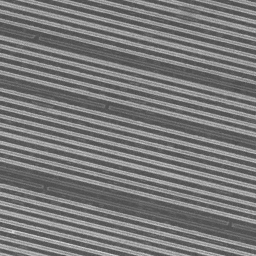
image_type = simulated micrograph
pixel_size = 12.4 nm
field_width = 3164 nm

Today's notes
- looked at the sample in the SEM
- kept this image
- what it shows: parallel lines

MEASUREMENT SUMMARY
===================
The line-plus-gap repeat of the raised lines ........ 104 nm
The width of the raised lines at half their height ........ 42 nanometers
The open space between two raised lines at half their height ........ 64.5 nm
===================